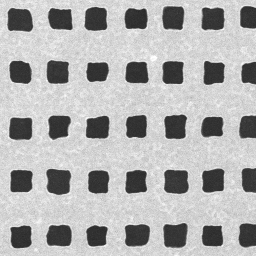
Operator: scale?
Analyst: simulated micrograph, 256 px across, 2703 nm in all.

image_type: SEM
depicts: a regular array of holes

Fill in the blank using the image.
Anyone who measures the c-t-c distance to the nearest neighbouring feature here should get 37.3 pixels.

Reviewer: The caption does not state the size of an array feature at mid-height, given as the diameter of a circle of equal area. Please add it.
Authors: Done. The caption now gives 253 nm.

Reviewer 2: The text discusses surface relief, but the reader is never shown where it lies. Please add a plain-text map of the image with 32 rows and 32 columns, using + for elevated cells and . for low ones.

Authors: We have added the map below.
++++++++++++++++++++++++++++++++
+...++...++..+++..++...++...++..
+...++...++..+++..++...++...++..
+...+++..++..+++..+++..+++..+++.
++++++++++++++++++++++++++++++++
++++++++++++++++++++++++++++++++
++++++++++++++++++++++++++++++++
++++++++++++++++++++++++++++++++
+...++...++...++..++...+++..++..
+...++...++..+++..++...++...++..
++++++++++++++++++++++++++.+++++
++++++++++++++++++++++++++++++++
++++++++++++++++++++++++++++++++
++++++++++++++++++++++++++++++++
+++++++.+++++++++.+++..++++++++.
+...++...++...++..+++..++...++..
+...++...++...++..+++..++...++..
++++++++++++++++++++++++++++++++
++++++++++++++++++++++++++++++++
++++++++++++++++++++++++++++++++
++++++++++++++++++++++++++++++++
++..++...++..+++..+++..+++..++..
+...++...++...++..+++..++...++..
+...++...++...++..+++...+...++..
++++++++++++++++++++++++++++++++
++++++++++++++++++++++++++++++++
++++++++++++++++++++++++++++++++
++++++++++++++++++++++++++++++++
++..++...++..+++...+...+++..++..
+...++...++..+++...+...++...++..
+...++...++..+++..+++..+++..++..
++++++++++++++++++++++++++++++++